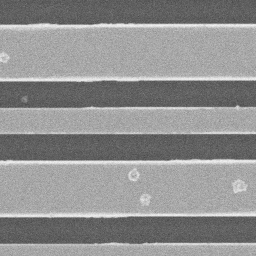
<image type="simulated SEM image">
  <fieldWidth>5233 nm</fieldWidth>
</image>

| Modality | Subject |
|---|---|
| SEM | lines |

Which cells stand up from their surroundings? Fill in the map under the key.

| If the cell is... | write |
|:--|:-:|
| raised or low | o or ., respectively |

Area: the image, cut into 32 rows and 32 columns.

................................
................................
................................
oooooooooooooooooooooooooooooooo
oooooooooooooooooooooooooooooooo
oooooooooooooooooooooooooooooooo
oooooooooooooooooooooooooooooooo
oooooooooooooooooooooooooooooooo
oooooooooooooooooooooooooooooooo
oooooooooooooooooooooooooooooooo
................................
................................
................................
..........oo...ooooooooooooooooo
oooooooooooooooooooooooooooooooo
oooooooooooooooooooooooooooooooo
oooooooooooooooooooooooooooooooo
................................
................................
................................
oooooooooooooooooooooooooooooooo
oooooooooooooooooooooooooooooooo
oooooooooooooooooooooooooooooooo
oooooooooooooooooooooooooooooooo
oooooooooooooooooooooooooooooooo
oooooooooooooooooooooooooooooooo
oooooooooooooooooooooooooooooooo
................................
................................
................................
..............o....ooooooooooooo
oooooooooooooooooooooooooooooooo